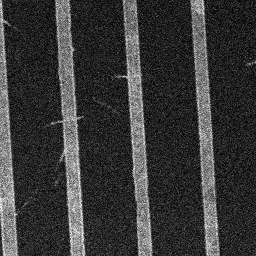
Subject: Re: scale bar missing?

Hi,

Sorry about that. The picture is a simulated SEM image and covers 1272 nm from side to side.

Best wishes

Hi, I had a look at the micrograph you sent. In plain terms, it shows one or a few lines or trenches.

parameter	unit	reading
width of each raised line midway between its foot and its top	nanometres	60.2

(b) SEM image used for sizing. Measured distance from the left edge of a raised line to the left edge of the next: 0.335 um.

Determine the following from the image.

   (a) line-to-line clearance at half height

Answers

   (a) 0.274 microns